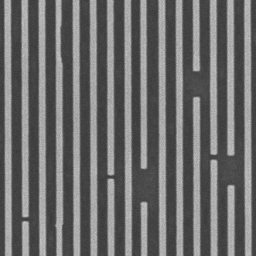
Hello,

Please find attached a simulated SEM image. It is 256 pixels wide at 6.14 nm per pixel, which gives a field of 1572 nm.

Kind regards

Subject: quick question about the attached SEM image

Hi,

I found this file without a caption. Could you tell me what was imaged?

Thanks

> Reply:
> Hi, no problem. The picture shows parallel lines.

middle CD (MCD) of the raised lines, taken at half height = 0.0407 um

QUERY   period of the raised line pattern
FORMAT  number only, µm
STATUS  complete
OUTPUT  0.105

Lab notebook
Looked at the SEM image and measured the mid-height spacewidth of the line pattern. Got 10.4 pixels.